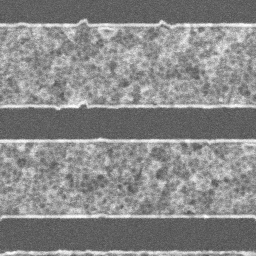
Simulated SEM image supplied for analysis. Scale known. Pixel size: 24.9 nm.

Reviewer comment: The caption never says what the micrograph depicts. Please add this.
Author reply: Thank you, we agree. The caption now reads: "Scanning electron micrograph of one or a few lines or trenches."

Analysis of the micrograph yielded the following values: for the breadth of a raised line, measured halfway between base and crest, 1.89 micrometres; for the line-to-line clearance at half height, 884 nm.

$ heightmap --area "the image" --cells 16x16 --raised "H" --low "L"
LLLLLLLLLLLLLLLL
LLLLLHLLLLLLLLLL
HHHHHHHHHHHHHHHH
HHHHHHHHHHHHHHHH
HHHHHHHHHHHHHHHH
HHHHHHHHHHHHHHHH
HHHHHLHHHHHHHHHH
LLLLLLLLLLLLLLLL
LLLLLLLLLLLLLLLL
HHHHHHHHHHHHHHHH
HHHHHHHHHHHHHHHH
HHHHHHHHHHHHHHHH
HHHHHHHHHHHHHHHH
HLLLLLLLLLLLLLLH
LLLLLLLLLLLLLLLL
LLLLLLLLLLLLLLLL